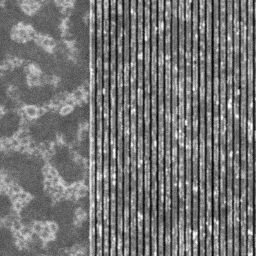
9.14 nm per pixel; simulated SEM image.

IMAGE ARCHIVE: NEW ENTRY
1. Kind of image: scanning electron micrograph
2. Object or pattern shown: parallel lines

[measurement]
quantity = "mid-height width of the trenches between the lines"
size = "0.024 microns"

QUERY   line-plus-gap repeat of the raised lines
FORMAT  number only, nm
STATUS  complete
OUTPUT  62.7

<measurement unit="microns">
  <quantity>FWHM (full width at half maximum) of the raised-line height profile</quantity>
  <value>0.04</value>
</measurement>